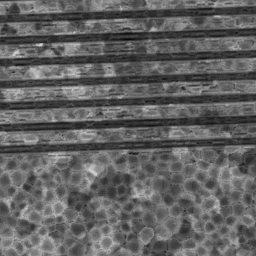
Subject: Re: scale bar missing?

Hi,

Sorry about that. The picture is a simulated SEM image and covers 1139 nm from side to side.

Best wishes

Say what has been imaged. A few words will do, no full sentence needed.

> parallel lines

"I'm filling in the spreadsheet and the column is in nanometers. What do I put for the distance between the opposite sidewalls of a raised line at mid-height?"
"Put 59.4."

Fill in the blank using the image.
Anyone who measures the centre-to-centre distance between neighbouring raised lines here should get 96.8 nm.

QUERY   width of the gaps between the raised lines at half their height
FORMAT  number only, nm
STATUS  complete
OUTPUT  36.1